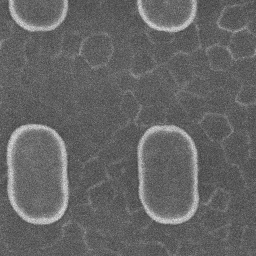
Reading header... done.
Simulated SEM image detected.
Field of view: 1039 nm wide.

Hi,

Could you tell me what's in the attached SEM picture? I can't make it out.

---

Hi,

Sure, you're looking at raised bodies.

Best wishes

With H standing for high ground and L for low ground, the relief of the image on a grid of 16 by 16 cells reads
LHHHLLLLLHHHLLLL
LHHHLLLLLHHHLLLL
LLLLLLLLLLLLLLLL
LLLLLLLLLLLLLLLL
LLLLLLLLLLLLLLLL
LLLLLLLLLLLLLLLL
LLLLLLLLLLLLLLLL
LLLLLLLLLLLLLLLL
LHHHLLLLLHHHLLLL
LHHHLLLLLHHHLLLL
LHHHLLLLLHHHLLLL
LHHHLLLLLHHHLLLL
LHHHLLLLLHHHLLLL
LHHHLLLLLLHHLLLL
LLLLLLLLLLLLLLLL
LLLLLLLLLLLLLLLL